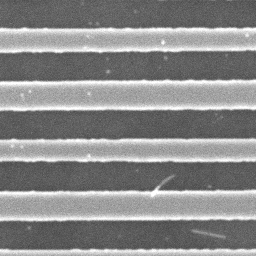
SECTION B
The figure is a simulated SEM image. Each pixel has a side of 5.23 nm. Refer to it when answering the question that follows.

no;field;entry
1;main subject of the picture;lines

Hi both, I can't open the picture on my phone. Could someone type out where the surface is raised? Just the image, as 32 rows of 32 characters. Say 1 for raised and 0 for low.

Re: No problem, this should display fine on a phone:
00000000000000000000000000000000
00000000000000000000000000000000
00000000000000000000000000000000
00000000000000000000000000000000
11111111111111111111111111111111
11111111111111111111111111111111
11101111000010000000000000000000
00000000000000000000000000000000
00000000000000000000000000000000
00000000000000000000000000000000
11111111111111111111111111111111
11111111111111111111111111111111
11111111111111111111111111111111
11111111111111111111111111111111
00000000000000000000000000000000
00000000000000000000000000000000
00000000000000000000000000000000
01001101111111011111111111111111
11111111111111111111111111111111
11111111111111111111111111111111
00000000000000000000000000000000
00000000000000000000000000000000
00000000000000000000000000000000
00000000000000000000000000000000
11111111111111111111111111111111
11111111111111111111111111111111
11111111111111111111111111111111
11111111000000000000000000000000
00000000000000000000000000000000
00000000000000000000000000000000
00000000000000000000000000000000
11111111111111111111111111111111